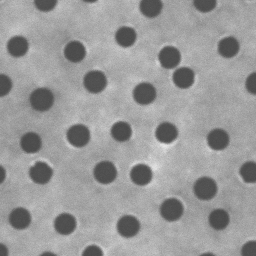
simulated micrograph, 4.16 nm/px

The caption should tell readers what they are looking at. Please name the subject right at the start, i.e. a regular array of holes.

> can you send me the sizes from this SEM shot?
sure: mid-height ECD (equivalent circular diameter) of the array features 90.3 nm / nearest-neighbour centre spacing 175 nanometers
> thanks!